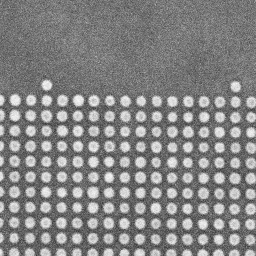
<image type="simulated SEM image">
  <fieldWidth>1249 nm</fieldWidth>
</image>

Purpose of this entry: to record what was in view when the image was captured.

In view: a regular array of raised bodies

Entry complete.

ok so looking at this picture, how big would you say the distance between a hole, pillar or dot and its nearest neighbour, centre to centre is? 73.7 nanometers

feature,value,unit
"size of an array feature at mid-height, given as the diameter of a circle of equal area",43.3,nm